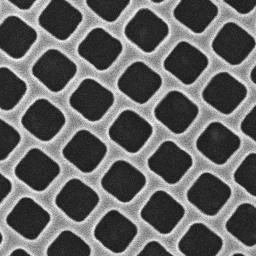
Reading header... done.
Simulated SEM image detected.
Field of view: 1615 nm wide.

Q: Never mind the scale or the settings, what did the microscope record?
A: a regular array of holes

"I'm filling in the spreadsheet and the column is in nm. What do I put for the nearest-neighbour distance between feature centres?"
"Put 312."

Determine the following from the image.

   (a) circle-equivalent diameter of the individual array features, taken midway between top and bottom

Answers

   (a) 0.253 microns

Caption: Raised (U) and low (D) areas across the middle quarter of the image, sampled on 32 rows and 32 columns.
DDDUUUUDDDDDUUUUDDDDDUUUUDDDDDDD
DDDUUUUUUDUUUUUDDDDDDDUUUDDDDDDD
DDDUUUUUUUUUUUUDDDDDDDDDUUUDDDDD
DDUUUUUUUUUUUUDDDDDDDDDDUUUUDDDD
DUUUDDDDUUUUUDDDDDDDDDDDUUUUUDDD
DUUUDDDDDDUUUDDDDDDDDDDDUUUUUUUU
UUUDDDDDDDDUUUDDDDDDDDDUUUUUUUUU
UUDDDDDDDDDDUUUDDDDDDDDUUUDDDDUU
UDDDDDDDDDDDDUUUDDDDDDUUUDDDDDDU
UDDDDDDDDDDDUUUUUUDDDUUUDDDDDDDD
UUDDDDDDDDDDUUUUUUUUUUUDDDDDDDDD
UUUDDDDDDDDUUUUUDUUUUUUDDDDDDDDD
UUUUDDDDDDUUUUDDDDUUUUUDDDDDDDDD
UUUUUDDDDUUUUDDDDDDDUUUDDDDDDDDD
UUUUUUUUUUUUDDDDDDDDDUUUDDDDDDDD
UUUUUUUUUUUUDDDDDDDDDDUUUDDDDDDU
UUUUDDUUUUUDDDDDDDDDDDUUUUDDDDUU
UUUDDDDUUUUDDDDDDDDDDDUUUUUUDUUU
UUDDDDDDDUUUDDDDDDDDDUUUUUUUUUUU
UDDDDDDDDDUUUDDDDDDDDUUUUDDUUUUU
DDDDDDDDDDDUUUDDDDDDUUUUDDDDDUUU
DDDDDDDDDDDUUUUDDDDUUUUDDDDDDDUU
DDDDDDDDDDUUUUUUUUUUUUDDDDDDDDDU
DDDDDDDDDDUUUUUUUUUUUDDDDDDDDDDD
UUDDDDDDDUUUUDDDUUUUUDDDDDDDDDDD
UUUDDDDDUUUUDDDDDUUUUDDDDDDDDDDD
UUUUDDDUUUUDDDDDDDUUUUDDDDDDDDDU
UUUUUUUUUUDDDDDDDDDDUUUDDDDDDDUU
UUUUUUUUUDDDDDDDDDDDUUUUDDDDDUUU
UDDDDUUUUDDDDDDDDDDDDUUUUUDDUUUU
DDDDDDUUUDDDDDDDDDDDUUUUUUUUUUUU
DDDDDDDUUUDDDDDDDDDUUUUUUUUUUUUD